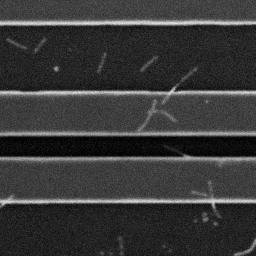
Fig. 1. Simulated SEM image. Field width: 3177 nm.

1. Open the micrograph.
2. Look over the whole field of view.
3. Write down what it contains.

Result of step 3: lines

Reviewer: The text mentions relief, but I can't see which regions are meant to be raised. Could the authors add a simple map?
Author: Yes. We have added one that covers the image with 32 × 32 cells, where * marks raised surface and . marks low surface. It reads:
********************************
********************************
********************************
................................
................................
................................
................................
................................
................................
................................
................................
.....****..****.**...*.*********
********************************
********************************
********************************
********************************
********************************
................................
................................
................................
********************************
********************************
********************************
********************************
********************************
................................
................................
................................
................................
................................
................................
................................